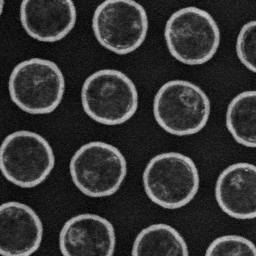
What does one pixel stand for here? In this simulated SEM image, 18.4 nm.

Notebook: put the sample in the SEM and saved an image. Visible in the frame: raised bodies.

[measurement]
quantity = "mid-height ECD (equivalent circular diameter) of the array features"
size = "0.945 um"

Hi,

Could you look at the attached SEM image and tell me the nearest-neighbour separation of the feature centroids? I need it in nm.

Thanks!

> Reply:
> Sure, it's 1340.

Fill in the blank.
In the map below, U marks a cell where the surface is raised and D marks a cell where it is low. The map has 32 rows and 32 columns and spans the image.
DDDUUUUUUDDDDUUUUDDDDDDDDDDDDDDD
DDDUUUUUUDDDUUUUUUDDDDDUUDDDDDDD
DDDUUUUUUDDDUUUUUUDDDUUUUUDDDDDD
DDDUUUUUUDDDUUUUUUDDDUUUUUUDDDDU
DDDDUUUUDDDDUUUUUUDDDUUUUUUDDDUU
DDDDDDDDDDDDDUUUUDDDDUUUUUUDDDUU
DDDDDDDDDDDDDDDDDDDDDDUUUUUDDDUU
DDDDDDDDDDDDDDDDDDDDDDDUUDDDDDUU
DDUUUUUDDDDDDDDDDDDDDDDDDDDDDDDU
DDUUUUUUDDDDUUUDDDDDDDDDDDDDDDDD
DUUUUUUUDDDUUUUUDDDDDUUDDDDDDDDD
DUUUUUUUDDUUUUUUUDDDUUUUUDDDDDDD
DDUUUUUDDDDUUUUUUDDDUUUUUUDDDUUU
DDDUUUDDDDDUUUUUUDDUUUUUUUDDDUUU
DDDDDDDDDDDDUUUUDDDDUUUUUUDDDUUU
DDDDDDDDDDDDDDDDDDDDUUUUUDDDDUUU
DDDDDDDDDDDDDDDDDDDDDDUUDDDDDUUU
DUUUUDDDDDDDDDDDDDDDDDDDDDDDDDUU
UUUUUUDDDDDUUUDDDDDDDDDDDDDDDDDD
UUUUUUDDDDUUUUUDDDDDDUDDDDDDDDDD
UUUUUUDDDUUUUUUDDDDUUUUUDDDDDDDD
DUUUUUDDDUUUUUUDDDUUUUUUDDDDUUUU
DDUUUDDDDUUUUUUDDDUUUUUUUDDUUUUU
DDDDDDDDDDUUUUDDDDUUUUUUDDDUUUUU
DDDDDDDDDDDDDDDDDDDUUUUUDDDUUUUU
DDDDDDDDDDDDDDDDDDDDUUUDDDDDUUUU
UUUUDDDDDDDDDDDDDDDDDDDDDDDDDUUU
UUUUUDDDDUUUUDDDDDDDDDDDDDDDDDDD
UUUUUDDDUUUUUUDDDDDUUDDDDDDDDDDD
UUUUUDDDUUUUUUDDDDUUUUDDDDDDDDDD
UUUUUDDDUUUUUUDDDUUUUUUDDDDUUUUD
UUUUDDDDUUUUUUDDDUUUUUUDDDUUUUUU